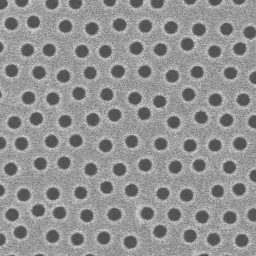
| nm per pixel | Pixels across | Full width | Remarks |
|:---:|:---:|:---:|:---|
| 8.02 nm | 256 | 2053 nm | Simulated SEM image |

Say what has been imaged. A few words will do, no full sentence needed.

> a regular array of holes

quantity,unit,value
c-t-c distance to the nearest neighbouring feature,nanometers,188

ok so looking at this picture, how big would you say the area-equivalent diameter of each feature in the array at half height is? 105 nanometers